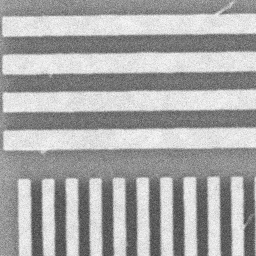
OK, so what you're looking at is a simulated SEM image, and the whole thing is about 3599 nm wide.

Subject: groups of lines, slits or small figures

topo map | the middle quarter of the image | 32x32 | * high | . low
********************************
********************************
................................
................................
................................
................................
................................
********************************
********************************
********************************
********************************
*************************.......
................................
................................
................................
................................
......................**..******
********************************
********************************
********************************
********************************
................................
................................
................................
................................
................................
................................
................................
................................
.**....**...***...***...***...**
.**....**...***...***...***...**
.**....**....**...***...***...**